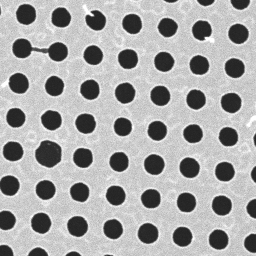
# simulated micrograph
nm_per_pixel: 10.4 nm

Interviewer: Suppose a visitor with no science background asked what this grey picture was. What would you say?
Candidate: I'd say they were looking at a regular array of holes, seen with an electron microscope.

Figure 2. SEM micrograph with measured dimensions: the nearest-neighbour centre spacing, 358 nm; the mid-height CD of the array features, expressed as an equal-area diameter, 214 nm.